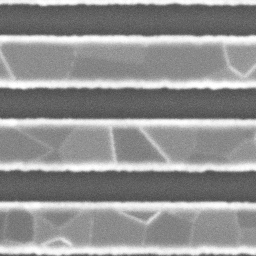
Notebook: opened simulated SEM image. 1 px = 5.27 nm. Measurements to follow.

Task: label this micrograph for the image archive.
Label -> lines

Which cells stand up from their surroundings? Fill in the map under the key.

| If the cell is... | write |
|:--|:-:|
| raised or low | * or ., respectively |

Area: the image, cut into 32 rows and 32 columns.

.....**...................****.*
................................
................................
................................
................................
********************************
********************************
********************************
********************************
********************************
********************************
................................
................................
................................
................................
********************************
********************************
********************************
********************************
********************************
********************************
................................
................................
................................
................................
*******************************.
********************************
********************************
********************************
********************************
********************************
********************************